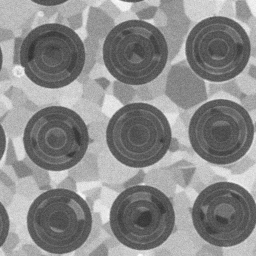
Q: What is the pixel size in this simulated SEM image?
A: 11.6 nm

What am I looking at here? an array of small figures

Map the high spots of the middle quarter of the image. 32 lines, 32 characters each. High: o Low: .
.oo..ooooo...oo......oo..oooooo.
oo...oooooo..ooo...ooo...ooooooo
oo..oooooooo..ooooooo...oooooooo
...oooooooooo..........ooooooooo
..oooooooooooo........oooooooooo
.ooooooooooooooooooooooooooooooo
oooooooooooooooooooooooooooooooo
oooooooooooooooooooooooooooooooo
oooooooooooooooooooooooooooooooo
oooooooooooooooooo.ooooooooooooo
ooooooooooooooo........ooooooooo
..ooooooooooo.....o.....oooooooo
....oooooooo...ooooooo...ooooooo
oo..oooooooo..ooo...ooo...oooooo
ooo..oooooo..oo.......oo..ooooo.
.oo...ooooo..oo..ooo...oo..oooo.
..oo..oooo..oo..ooooo..oo..oooo.
..oo..oooo..oo..ooooo..oo..oooo.
o..o..oooo..oo..ooooo..oo..oooo.
...o..ooooo..o...oooo..oo..oooo.
..oo..ooooo..oo.......oo...ooooo
..oo..ooooo...oo.....ooo..oooooo
.oo..ooooooo..ooooooooo..ooooooo
oo...oooooooo...ooooo....ooooooo
....oooooooooo..........oooooooo
...oooooooooooo.......oooooooooo
.ooooooooooooooooooooooooooooooo
oooooooooooooooooooooooooooooooo
oooooooooooooooooooooooooooooooo
oooooooooooooooooooooooooooooooo
ooooooooooooooooo.....oooooooooo
..ooooooooooooo.........oooooooo